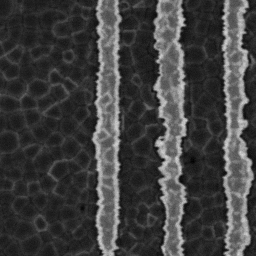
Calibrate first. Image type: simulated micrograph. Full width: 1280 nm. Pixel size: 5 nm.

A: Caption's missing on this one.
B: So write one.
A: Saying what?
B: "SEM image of one or a few lines or trenches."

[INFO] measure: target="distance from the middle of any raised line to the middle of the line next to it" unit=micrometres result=0.319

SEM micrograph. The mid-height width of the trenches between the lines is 233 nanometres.